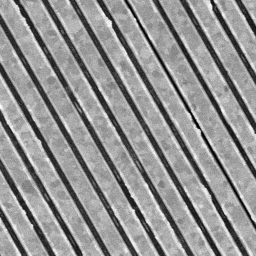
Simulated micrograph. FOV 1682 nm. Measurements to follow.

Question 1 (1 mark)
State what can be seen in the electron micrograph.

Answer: parallel lines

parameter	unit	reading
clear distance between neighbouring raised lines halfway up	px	6.83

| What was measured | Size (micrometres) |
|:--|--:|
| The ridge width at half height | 0.111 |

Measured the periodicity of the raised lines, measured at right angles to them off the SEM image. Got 157 nanometers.